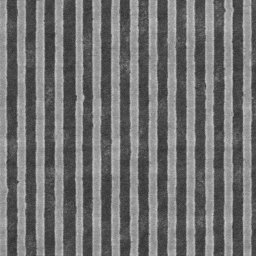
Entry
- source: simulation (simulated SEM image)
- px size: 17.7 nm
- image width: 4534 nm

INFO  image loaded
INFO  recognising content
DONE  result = parallel lines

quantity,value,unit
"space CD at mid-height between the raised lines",0.215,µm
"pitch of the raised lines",333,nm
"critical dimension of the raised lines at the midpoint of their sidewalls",0.115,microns